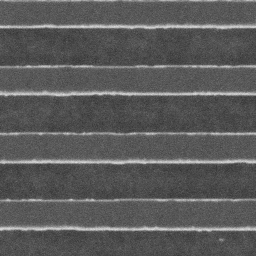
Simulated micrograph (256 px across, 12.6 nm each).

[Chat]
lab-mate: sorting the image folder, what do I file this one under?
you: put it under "lines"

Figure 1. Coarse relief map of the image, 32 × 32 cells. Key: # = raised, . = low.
################################
################################
################################
..................##.......##...
................................
................................
................................
................................
################################
################################
################################
################################
................................
................................
................................
................................
................................
################################
################################
################################
................................
................................
................................
................................
................................
################################
################################
################################
################################
................................
................................
................................